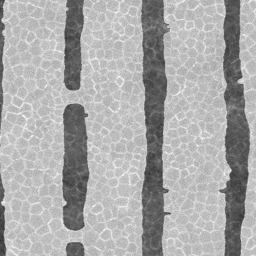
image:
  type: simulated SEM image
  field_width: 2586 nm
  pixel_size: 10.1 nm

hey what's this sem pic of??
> one or a few lines or trenches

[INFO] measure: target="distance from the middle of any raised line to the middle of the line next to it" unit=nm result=804